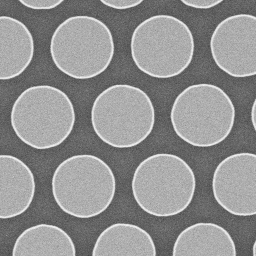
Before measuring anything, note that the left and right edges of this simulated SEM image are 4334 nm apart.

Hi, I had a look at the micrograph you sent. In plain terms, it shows an array of small figures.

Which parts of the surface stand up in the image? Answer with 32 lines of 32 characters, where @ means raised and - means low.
---@@@@------@@@@------@@@@-----
--------------------------------
@@------@@@@------@@@@------@@@@
@@@----@@@@@@----@@@@@@----@@@@@
@@@@---@@@@@@@---@@@@@@@---@@@@@
@@@@--@@@@@@@@--@@@@@@@@--@@@@@@
@@@@--@@@@@@@@---@@@@@@@--@@@@@@
@@@@---@@@@@@@---@@@@@@@---@@@@@
@@@----@@@@@@----@@@@@@-----@@@@
@@-------@@@-------@@@-------@@-
--------------------------------
---@@@@@-----@@@@@-----@@@@@----
--@@@@@@@---@@@@@@@---@@@@@@@---
--@@@@@@@---@@@@@@@---@@@@@@@---
-@@@@@@@@---@@@@@@@--@@@@@@@@---
-@@@@@@@@---@@@@@@@---@@@@@@@---
--@@@@@@@---@@@@@@@---@@@@@@@---
---@@@@@-----@@@@@-----@@@@@----
-----@--------------------------
@---------@@-------@@@-------@@@
@@@-----@@@@@-----@@@@@-----@@@@
@@@@---@@@@@@@---@@@@@@@---@@@@@
@@@@---@@@@@@@---@@@@@@@---@@@@@
@@@@---@@@@@@@---@@@@@@@---@@@@@
@@@@---@@@@@@@---@@@@@@@---@@@@@
@@@@---@@@@@@@---@@@@@@@---@@@@@
@@@-----@@@@@-----@@@@-------@@@
--------------------------------
----@@@-------@@@-------@@@@----
--@@@@@@----@@@@@@@---@@@@@@@---
--@@@@@@@---@@@@@@@---@@@@@@@---
--@@@@@@@---@@@@@@@---@@@@@@@---